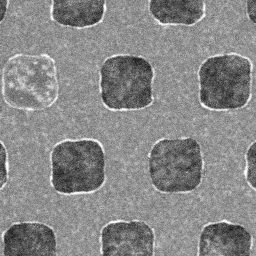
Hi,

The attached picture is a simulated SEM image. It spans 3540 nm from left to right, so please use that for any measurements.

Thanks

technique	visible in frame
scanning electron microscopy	holes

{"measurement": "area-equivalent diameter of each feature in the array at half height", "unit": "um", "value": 0.787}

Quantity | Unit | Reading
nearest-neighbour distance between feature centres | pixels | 96.2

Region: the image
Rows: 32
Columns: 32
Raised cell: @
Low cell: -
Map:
-@@@@@@------@@@@@@-------@@@@@-
-@@@@@@------@@@@@@-------@@@@@-
@@@@@@@------@@@@@@@-----@@@@@@-
@@@@@@@@@@@@@@@@@@@@@@@@@@@@@@@@
@@@@@@@@@@@@@@@@@@@@@@@@@@@@@@@@
@@@@@@@@@@@@@@@@@@@@@@@@@@@@@@@@
@@@@@@@@@@@@@@@@@@@@@@@@@@@@@@@@
@-----@@@@@@@-----@@@@@@@@-----@
@------@@@@@@------@@@@@@------@
-------@@@@@@------@@@@@@------@
-------@@@@@@------@@@@@@------@
-------@@@@@@------@@@@@@------@
@------@@@@@@------@@@@@@------@
@@@---@@@@@@@@----@@@@@@@@----@@
@@@@@@@@@@@@@@@@@@@@@@@@@@@@@@@@
@@@@@@@@@@@@@@@@@@@@@@@@@@@@@@@@
@@@@@@@@@@@@@@@@@@@@@@@@@@@@@@@@
@@@@@@@@@@-@@@@@@@@@----@@@@@@@@
-@@@@@@------@@@@@@------@@@@@@-
-@@@@@-------@@@@@@------@@@@@@-
-@@@@@-------@@@@@@------@@@@@@-
-@@@@@-------@@@@@@------@@@@@@-
-@@@@@-------@@@@@@------@@@@@@-
@@@@@@@-----@@@@@@@-----@@@@@@@@
@@@@@@@@@@@@@@@@@@@@@@@@@@@@@@@@
@@@@@@@@@@@@@@@@@@@@@@@@@@@@@@@@
@@@@@@@@@@@@@@@@@@@@@@@@@@@@@@@@
@@@@@@@@@@@@@@@@@@@@@@@@@@@@@@@@
@-----@@@@@@@------@@@@@@-----@@
-------@@@@@@------@@@@@@------@
@------@@@@@@------@@@@@@------@
-------@@@@@@------@@@@@@------@